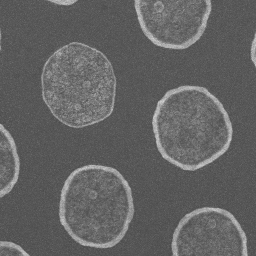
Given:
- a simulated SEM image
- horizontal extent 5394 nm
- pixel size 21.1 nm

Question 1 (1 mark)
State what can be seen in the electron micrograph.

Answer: raised bodies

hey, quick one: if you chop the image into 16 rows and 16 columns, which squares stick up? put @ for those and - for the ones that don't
---------@@@@---
---------@@@@---
----------@@----
----------------
----------------
----------------
----------@@@@--
----------@@@@--
----------@@@@--
@---------@@@@--
@----@----------
@---@@@@--------
----@@@@--------
----@@@@----@@--
----@@@@---@@@@-
@----------@@@@-